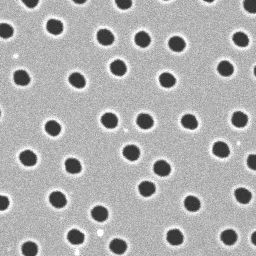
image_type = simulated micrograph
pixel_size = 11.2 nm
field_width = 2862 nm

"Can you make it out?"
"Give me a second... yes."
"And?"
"a regular array of holes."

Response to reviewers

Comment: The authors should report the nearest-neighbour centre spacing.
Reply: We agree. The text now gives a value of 0.396 micrometres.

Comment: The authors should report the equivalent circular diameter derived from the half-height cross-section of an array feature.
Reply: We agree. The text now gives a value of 192 nm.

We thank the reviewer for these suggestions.